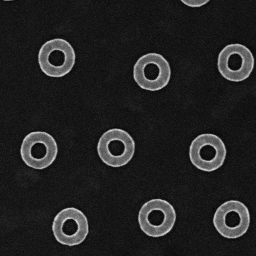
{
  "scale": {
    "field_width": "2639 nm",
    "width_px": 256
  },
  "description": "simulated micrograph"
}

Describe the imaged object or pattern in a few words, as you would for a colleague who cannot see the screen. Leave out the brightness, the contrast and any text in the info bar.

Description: a regular array of ring-shaped raised bodies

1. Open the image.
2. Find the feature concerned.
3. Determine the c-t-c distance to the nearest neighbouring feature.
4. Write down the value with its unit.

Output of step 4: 77 px